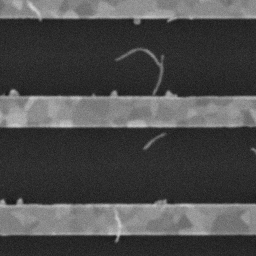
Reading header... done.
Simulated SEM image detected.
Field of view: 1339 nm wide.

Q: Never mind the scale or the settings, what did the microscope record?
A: lines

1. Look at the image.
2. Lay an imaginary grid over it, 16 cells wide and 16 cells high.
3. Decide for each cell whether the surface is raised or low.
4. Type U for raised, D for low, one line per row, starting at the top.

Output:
UUUUUUUUUUUUUUUU
DDDDDDDDDDDDDDDD
DDDDDDDDDDDDDDDD
DDDDDDDDDDDDDDDD
DDDDDDDDDDDDDDDD
DDDDDDDDDDDDDDDD
UUUUUUUUUUUUUUUU
UUUUUUUUUUUUUUUU
DDDDDDDDDDDDDDDD
DDDDDDDDDDDDDDDD
DDDDDDDDDDDDDDDD
DDDDDDDDDDDDDDDD
DDDDDDDDDDDDDDDD
UUUUUUUUUUUUUUUU
UUUUUUUUUUUUUUUU
DDDDDDDDDDDDDDDD